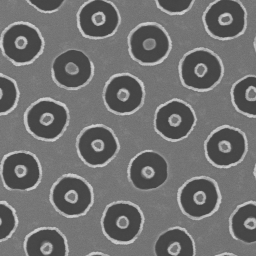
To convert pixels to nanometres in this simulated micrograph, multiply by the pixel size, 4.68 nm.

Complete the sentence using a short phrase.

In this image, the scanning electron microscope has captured a regular array of ring-shaped grooves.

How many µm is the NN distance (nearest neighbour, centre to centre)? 0.265